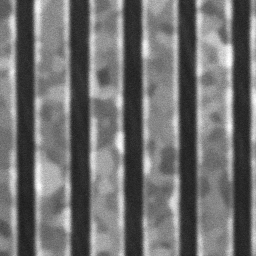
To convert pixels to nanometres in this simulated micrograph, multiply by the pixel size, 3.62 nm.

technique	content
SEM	parallel lines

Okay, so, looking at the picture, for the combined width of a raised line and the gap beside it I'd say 54.2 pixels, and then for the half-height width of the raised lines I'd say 0.117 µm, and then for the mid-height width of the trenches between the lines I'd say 77.5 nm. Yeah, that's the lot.